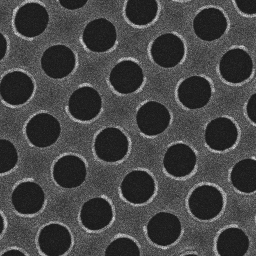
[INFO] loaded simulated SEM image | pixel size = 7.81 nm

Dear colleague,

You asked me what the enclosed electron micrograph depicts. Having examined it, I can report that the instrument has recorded a regular array of holes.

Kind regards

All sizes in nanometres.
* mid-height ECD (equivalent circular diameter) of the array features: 264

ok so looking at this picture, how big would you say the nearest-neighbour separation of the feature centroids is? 383 nm